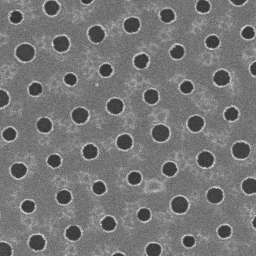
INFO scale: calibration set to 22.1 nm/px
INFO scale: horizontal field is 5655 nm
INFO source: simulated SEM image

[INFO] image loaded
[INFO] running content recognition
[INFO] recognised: a regular array of holes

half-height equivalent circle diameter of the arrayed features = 335 nanometres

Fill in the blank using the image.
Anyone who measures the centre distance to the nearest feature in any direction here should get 804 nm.